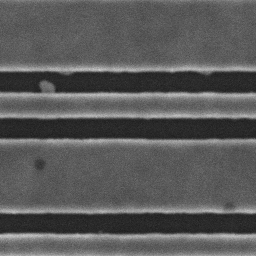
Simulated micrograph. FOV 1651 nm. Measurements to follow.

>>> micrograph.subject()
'lines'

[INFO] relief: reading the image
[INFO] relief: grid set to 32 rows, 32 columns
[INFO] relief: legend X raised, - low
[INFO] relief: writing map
XXXXXXXXXXXXXXXXXXXXXXXXXXXXXXXX
XXXXXXXXXXXXXXXXXXXXXXXXXXXXXXXX
XXXXXXXXXXXXXXXXXXXXXXXXXXXXXXXX
XXXXXXXXXXXXXXXXXXXXXXXXXXXXXXXX
XXXXXXXXXXXXXXXXXXXXXXXXXXXXXXXX
XXXXXXXXXXXXXXXXXXXXXXXXXXXXXXXX
XXXXXXXXXXXXXXXXXXXXXXXXXXXXXXXX
XXXXXXXXXXXXXXXXXXXXXXXXXXXXXXXX
XXXXXXXXXXXXXXXXXXXXXXXXXXXXXXXX
--------------------------------
--------------------------------
--------------------------------
XXXXXXXXXXXXXXXXXXXXXXXXXXXXXXXX
XXXXXXXXXXXXXXXXXXXXXXXXXXXXXXXX
XXXXXXXXXXXXXXXXXXXXXXXXXXXXXXXX
--------------------------------
--------------------------------
XXXXXXXXXX-XXXXXXXX-------XXXXXX
XXXXXXXXXXXXXXXXXXXXXXXXXXXXXXXX
XXXXXXXXXXXXXXXXXXXXXXXXXXXXXXXX
XXXXXXXXXXXXXXXXXXXXXXXXXXXXXXXX
XXXXXXXXXXXXXXXXXXXXXXXXXXXXXXXX
XXXXXXXXXXXXXXXXXXXXXXXXXXXXXXXX
XXXXXXXXXXXXXXXXXXXXXXXXXXXXXXXX
XXXXXXXXXXXXXXXXXXXXXXXXXXXXXXXX
XXXXXXXXXXXXXXXXXXXXXXXXXXXXXXXX
XXXXXXXXXXXXXXXXXXXXXXXXXXXXXXXX
--------------------------------
--------------------------------
XXXXXXXXXXXXXXXXXXXXXXXXXXXXXXXX
XXXXXXXXXXXXXXXXXXXXXXXXXXXXXXXX
XXXXXXXXXXXXXXXXXXXXXXXXXXXXXXXX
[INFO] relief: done